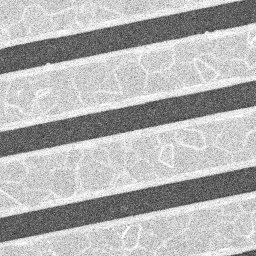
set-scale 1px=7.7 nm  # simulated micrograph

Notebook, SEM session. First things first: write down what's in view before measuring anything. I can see one or a few lines or trenches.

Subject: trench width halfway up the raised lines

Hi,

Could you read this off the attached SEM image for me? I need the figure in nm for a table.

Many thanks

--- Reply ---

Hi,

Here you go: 227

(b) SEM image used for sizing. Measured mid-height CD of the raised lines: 408 nanometres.